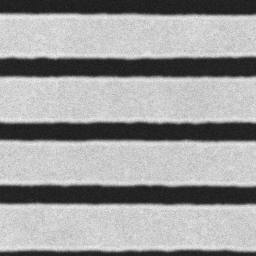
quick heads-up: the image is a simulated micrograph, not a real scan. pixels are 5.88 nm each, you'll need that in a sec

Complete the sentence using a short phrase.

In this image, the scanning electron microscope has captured lines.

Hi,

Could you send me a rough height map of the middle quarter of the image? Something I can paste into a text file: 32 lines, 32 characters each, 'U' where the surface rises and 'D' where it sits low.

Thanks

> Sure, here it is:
DDDDDDDDDDDDDDDDDDDDDDDDDDDDDDDD
DDDDDDDDDDDDDDDDDDDDDDDDDDDDDDDD
DDDDDDDDDDDDDDDDDDDDDDDDDDDDDDDD
UUUUUUUUUUUUUUUUUUUUUUUUUUUUDUUU
UUUUUUUUUUUUUUUUUUUUUUUUUUUUUUUU
UUUUUUUUUUUUUUUUUUUUUUUUUUUUUUUU
UUUUUUUUUUUUUUUUUUUUUUUUUUUUUUUU
UUUUUUUUUUUUUUUUUUUUUUUUUUUUUUUU
UUUUUUUUUUUUUUUUUUUUUUUUUUUUUUUU
UUUUUUUUUUUUUUUUUUUUUUUUUUUUUUUU
UUUUUUUUUUUUUUUUUUUUUUUUUUUUUUUU
UUUUUUUUUUUUUUUUUUUUUUUUUUUUUUUU
UUUUUUUUUUUUUUUUUUUUUUUUUUUUUUUU
UUUUUUUUUUUUUUUUUUUUUUUUUUUUUUUU
UUUUUUUUDDDUUUDUUUDDUUUUUUUUUUUU
DDDDDDDDDDDDDDDDDDDDDDDDDDDDDDDD
DDDDDDDDDDDDDDDDDDDDDDDDDDDDDDDD
DDDDDDDDDDDDDDDDDDDDDDDDDDDDDDDD
DDDDDDDDDDDDDDDDDDDDDDDDDDDDDDDD
UUUUUUUUUUUUUUUUUUUUUUUUUUUUUUUU
UUUUUUUUUUUUUUUUUUUUUUUUUUUUUUUU
UUUUUUUUUUUUUUUUUUUUUUUUUUUUUUUU
UUUUUUUUUUUUUUUUUUUUUUUUUUUUUUUU
UUUUUUUUUUUUUUUUUUUUUUUUUUUUUUUU
UUUUUUUUUUUUUUUUUUUUUUUUUUUUUUUU
UUUUUUUUUUUUUUUUUUUUUUUUUUUUUUUU
UUUUUUUUUUUUUUUUUUUUUUUUUUUUUUUU
UUUUUUUUUUUUUUUUUUUUUUUUUUUUUUUU
UUUUUUUUUUUUUUUUUUUUUUUUUUUUUUUU
UUUUUUUUUUUUUUUUUUUUUUUUUUUUUUUU
DDDDDDDDDDDDDDDDDDDDDDDDDDUUUDDD
DDDDDDDDDDDDDDDDDDDDDDDDDDDDDDDD